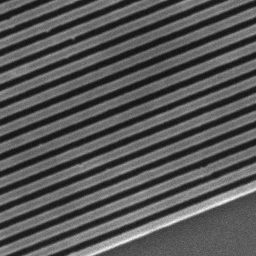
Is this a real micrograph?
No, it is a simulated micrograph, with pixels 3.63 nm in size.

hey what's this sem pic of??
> parallel lines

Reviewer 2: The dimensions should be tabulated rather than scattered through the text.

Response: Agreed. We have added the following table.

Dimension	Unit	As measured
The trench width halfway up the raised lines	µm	0.0278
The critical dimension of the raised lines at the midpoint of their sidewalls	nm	31.2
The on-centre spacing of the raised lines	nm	58.6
